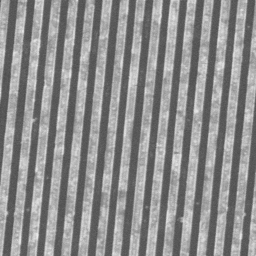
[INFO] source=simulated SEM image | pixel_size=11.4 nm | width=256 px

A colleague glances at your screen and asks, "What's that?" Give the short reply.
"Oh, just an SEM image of parallel lines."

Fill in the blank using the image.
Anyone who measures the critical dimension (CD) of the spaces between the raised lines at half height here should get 96.4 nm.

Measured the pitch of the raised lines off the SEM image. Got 192 nm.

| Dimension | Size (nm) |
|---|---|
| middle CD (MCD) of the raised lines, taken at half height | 96.4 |